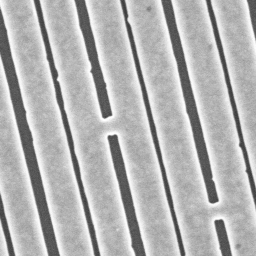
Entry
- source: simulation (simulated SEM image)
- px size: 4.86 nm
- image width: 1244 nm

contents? parallel lines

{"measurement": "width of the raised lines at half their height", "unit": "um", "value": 0.161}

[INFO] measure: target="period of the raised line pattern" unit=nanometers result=204